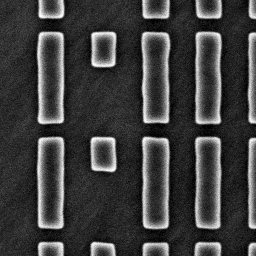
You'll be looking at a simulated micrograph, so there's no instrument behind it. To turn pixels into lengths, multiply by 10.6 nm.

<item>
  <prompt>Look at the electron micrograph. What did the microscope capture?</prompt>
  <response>wiring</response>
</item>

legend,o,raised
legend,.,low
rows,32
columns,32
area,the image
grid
.....ooo..........ooo....ooo...o
.....ooo..........ooo....ooo...o
................................
................................
.....ooo....oo....ooo....oo....o
.....ooo....oo....ooo....ooo...o
.....ooo....oo....ooo....ooo...o
.....ooo....oo....ooo....ooo...o
.....ooo..........ooo....oo....o
.....ooo..........ooo....ooo...o
.....ooo..........ooo....ooo...o
.....ooo..........ooo....ooo...o
.....ooo..........ooo....ooo...o
.....ooo..........ooo....oo....o
.....ooo..........ooo....ooo...o
................................
................................
.....ooo....oo....ooo....oo....o
.....ooo...ooo....ooo....ooo...o
.....ooo...ooo....ooo....ooo...o
.....ooo....oo....ooo....ooo...o
.....ooo..........ooo....ooo...o
.....ooo..........ooo....ooo...o
.....ooo..........ooo....ooo...o
.....ooo..........ooo....oo....o
.....ooo..........ooo...ooo....o
.....ooo..........ooo...ooo....o
.....ooo..........ooo....oo....o
......o............o......o.....
................................
.....ooo....oo....ooo....oo.....
.....ooo...ooo....ooo...oooo...o